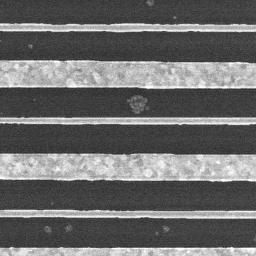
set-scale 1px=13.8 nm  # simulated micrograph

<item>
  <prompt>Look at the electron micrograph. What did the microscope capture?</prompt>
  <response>lines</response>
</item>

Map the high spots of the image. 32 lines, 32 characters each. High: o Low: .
................................
................................
................................
................................
................................
................................
................................
................................
oooooooooooooooooooooooooooooooo
oooooooooooooooooooooooooooooooo
oooooooooooooooooooooooooooooooo
................................
................................
................................
................................
................................
................................
................................
................................
oooooooooooooooooooooooooooooooo
oooooooooooooooooooooooooooooooo
oooooooooooooooooooooooooooooooo
..........................ooo..o
................................
................................
................................
................................
................................
................................
................................
................................
oooooooooooooooooooooooooooooooo